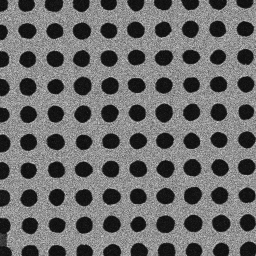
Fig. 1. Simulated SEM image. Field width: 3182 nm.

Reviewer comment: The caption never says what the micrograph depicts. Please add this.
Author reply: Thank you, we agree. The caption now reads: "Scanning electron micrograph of a regular array of holes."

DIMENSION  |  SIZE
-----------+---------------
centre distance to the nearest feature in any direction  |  27.1 px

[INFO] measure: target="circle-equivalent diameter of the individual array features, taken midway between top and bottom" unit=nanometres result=210